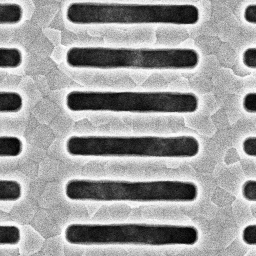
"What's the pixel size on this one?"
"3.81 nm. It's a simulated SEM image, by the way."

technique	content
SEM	holes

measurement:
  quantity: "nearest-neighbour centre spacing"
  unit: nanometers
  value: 166